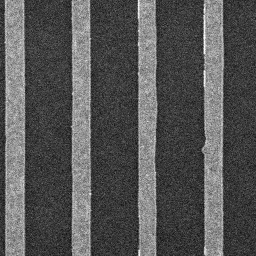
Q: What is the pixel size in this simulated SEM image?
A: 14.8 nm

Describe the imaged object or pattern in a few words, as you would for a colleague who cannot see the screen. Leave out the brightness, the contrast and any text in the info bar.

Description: one or a few lines or trenches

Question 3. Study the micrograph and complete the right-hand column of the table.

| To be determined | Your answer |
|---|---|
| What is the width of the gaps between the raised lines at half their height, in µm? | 0.724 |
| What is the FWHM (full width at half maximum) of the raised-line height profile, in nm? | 249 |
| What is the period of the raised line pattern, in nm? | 978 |